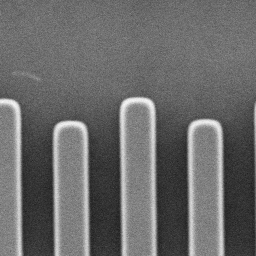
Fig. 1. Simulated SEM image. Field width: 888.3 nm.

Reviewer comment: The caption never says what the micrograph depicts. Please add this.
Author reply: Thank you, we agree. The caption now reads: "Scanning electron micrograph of groups of lines, slits or small figures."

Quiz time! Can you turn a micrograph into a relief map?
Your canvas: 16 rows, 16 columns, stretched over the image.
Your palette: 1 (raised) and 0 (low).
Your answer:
0000000000000000
0000000000000000
0000000000000000
0000000000000000
0000000000000000
0000000000000000
1000000010000000
1000000011000000
1001100011001100
1001100011001100
1001100011001100
1001100011001100
1001100011001100
1001100011001100
1001110011001100
1001110011001100